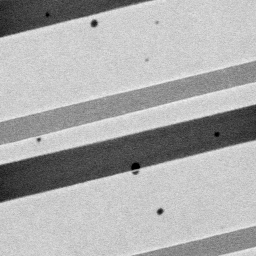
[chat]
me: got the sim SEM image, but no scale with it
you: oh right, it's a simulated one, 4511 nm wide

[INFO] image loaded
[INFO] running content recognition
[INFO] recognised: lines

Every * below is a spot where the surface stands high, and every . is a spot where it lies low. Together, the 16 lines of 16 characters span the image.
........********
....************
****************
****************
****************
****************
****************
************....
*******.........
***..........***
.........*******
.....***********
.***************
****************
****************
****************